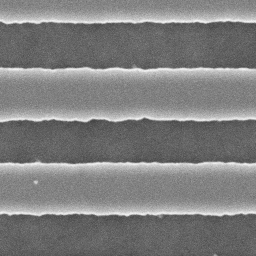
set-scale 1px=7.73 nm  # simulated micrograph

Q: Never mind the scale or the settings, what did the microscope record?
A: lines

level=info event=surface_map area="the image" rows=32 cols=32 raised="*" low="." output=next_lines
********************************
********************************
********************************
................................
................................
................................
................................
................................
..........*.....................
********************************
********************************
********************************
********************************
********************************
********************************
................................
................................
................................
................................
................................
*********.**********************
********************************
********************************
********************************
********************************
********************************
********************************
................................
................................
................................
................................
................................